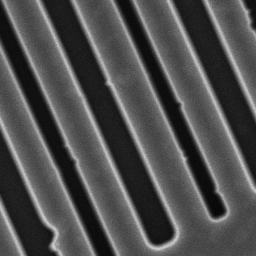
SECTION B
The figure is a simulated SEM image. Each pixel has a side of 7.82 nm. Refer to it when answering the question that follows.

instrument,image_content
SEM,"parallel lines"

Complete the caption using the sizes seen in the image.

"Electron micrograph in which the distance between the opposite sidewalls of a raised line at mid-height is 277 nanometers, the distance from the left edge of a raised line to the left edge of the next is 58.4 pixels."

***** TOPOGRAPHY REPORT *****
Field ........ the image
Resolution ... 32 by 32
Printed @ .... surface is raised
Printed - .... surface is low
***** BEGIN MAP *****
@@@@@----@@@@@---@@@@@----@@@@@-
-@@@@@----@@@@@--@@@@@----@@@@@-
-@@@@@----@@@@@---@@@@-----@@@@-
--@@@@@---@@@@@@--@@@@@----@@@@@
--@@@@@----@@@@@--@@@@@-----@@@@
---@@@@----@@@@@@--@@@@@----@@@@
@--@@@@@----@@@@@--@@@@@----@@@@
@--@@@@@----@@@@@@--@@@@@----@@@
@---@@@@@----@@@@@--@@@@@----@@@
@@--@@@@@----@@@@@@--@@@@@----@@
@@---@@@@@----@@@@@--@@@@@----@@
@@@--@@@@@----@@@@@---@@@@-----@
@@@---@@@@@----@@@@@--@@@@@----@
@@@@--@@@@@----@@@@@---@@@@-----
@@@@---@@@@-----@@@@@--@@@@@----
@@@@@--@@@@@----@@@@@--@@@@@----
@@@@@---@@@@----@@@@@@--@@@@@---
-@@@@@--@@@@@----@@@@@--@@@@@---
-@@@@@--@@@@@----@@@@@@--@@@@@--
--@@@@---@@@@@----@@@@@--@@@@@--
--@@@@@--@@@@@----@@@@@---@@@@@-
---@@@@---@@@@@----@@@@@--@@@@@-
---@@@@@--@@@@@----@@@@@---@@@@-
----@@@@---@@@@@----@@@@@--@@@@@
----@@@@@--@@@@@----@@@@@--@@@@@
----@@@@@---@@@@----@@@@@@--@@@@
@----@@@@@--@@@@@----@@@@@--@@@@
@----@@@@@--@@@@@----@@@@@@@@@@@
@@----@@@@---@@@@@----@@@@@@@@@@
@@-----@@@@--@@@@@----@@@@@@@@@@
@@----@@@@@---@@@@@--@@@@@@@@@@@
@@@----@@@@@--@@@@@@@@@@@@@@@@@@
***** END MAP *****